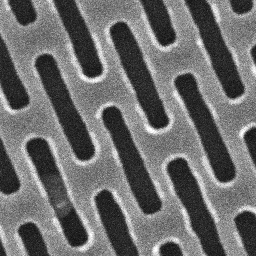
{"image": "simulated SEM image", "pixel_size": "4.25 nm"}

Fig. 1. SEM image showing holes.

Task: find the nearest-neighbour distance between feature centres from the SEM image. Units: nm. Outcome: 345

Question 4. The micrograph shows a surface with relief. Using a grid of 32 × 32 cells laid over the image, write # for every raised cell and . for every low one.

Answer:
#...###...########...##...###...
##...##...########...###...##..#
##..####...#######...###...#####
########...###..###...###..#####
#########...##...##...###...####
.########...##...###.####...####
.########...###...########...##.
..##...###...##...########...###
..##...###...##....########...##
..###...###.####...###..###...##
...##...########...###...##...##
...###...########...##...###...#
#...##...########...###...######
#..####...###..###...##...######
#######...###..###...###...#####
########...##...###..###...#####
########...###..#########..####.
####..##...###...########...##..
.##...###...##...########...###.
.###...##...###...########...##.
..##...########...###...##...###
..###...#######....##...###...##
..###...########...##....##..###
...##...########...###...#######
######...###..###...##...#######
######...###...##...###...######
#######...##...###..###...####.#
#######...###...########...##...
##...###...##...########...###..
##...###...##...#########..###..
###...###..###...###..###...##..
.##...########...###...##...###.